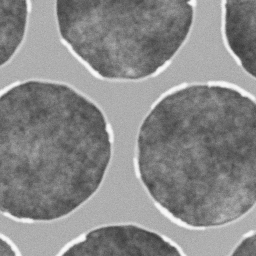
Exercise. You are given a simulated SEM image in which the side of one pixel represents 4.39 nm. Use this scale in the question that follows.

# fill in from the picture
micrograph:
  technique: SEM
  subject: holes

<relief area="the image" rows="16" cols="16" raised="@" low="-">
--@@--------@@--
--@@--------@@--
-@@@--------@@--
-@@@@------@@@@-
@@@@@@----@@@@@@
@---@@@@@@@---@@
------@@@@------
-------@@-------
-------@@-------
-------@@-------
-------@@-------
------@@@-------
-----@@@@@------
@---@@@@@@@----@
@@@@@@---@@@@@@@
-@@@-------@@@@-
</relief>